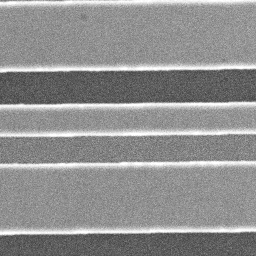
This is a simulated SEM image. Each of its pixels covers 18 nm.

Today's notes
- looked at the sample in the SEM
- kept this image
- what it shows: lines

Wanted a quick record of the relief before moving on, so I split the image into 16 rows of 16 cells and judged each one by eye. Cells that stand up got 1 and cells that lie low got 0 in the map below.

1111111111111111
1111111111111111
1111111111111111
1111111111111111
0000000000000000
0000000000000000
0000000000011111
1111111111111111
1111111111111111
1111111111111111
1111111111111111
1111111111111111
1111111111111111
1111111111111111
1111111100000000
0000000000000000